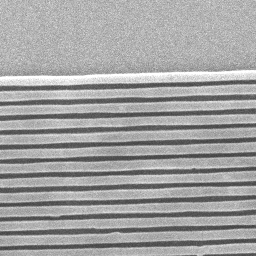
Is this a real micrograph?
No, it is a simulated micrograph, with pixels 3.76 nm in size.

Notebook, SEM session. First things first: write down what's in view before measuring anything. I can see parallel lines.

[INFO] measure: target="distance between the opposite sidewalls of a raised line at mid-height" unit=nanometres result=33.8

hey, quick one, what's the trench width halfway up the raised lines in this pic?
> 18.8 nanometres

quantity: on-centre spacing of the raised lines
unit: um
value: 0.0543